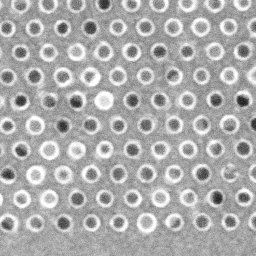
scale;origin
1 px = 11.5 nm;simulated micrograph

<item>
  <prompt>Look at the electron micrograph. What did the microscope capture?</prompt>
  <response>a regular array of raised bodies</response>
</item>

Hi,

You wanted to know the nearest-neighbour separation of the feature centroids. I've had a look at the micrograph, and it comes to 318 nanometers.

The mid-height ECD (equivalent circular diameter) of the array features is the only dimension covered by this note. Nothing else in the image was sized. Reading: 0.184 µm